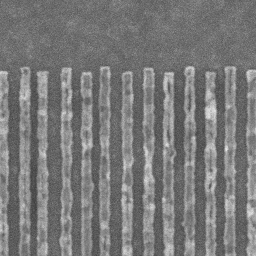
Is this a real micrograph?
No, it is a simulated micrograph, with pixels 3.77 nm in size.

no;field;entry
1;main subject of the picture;parallel lines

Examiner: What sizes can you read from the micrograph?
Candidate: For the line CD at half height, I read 0.0297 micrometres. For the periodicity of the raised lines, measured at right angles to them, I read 77.2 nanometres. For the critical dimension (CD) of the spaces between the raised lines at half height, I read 49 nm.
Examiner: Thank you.